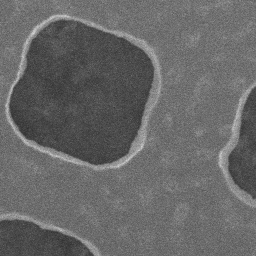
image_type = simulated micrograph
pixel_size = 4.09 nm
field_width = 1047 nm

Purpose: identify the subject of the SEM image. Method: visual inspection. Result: holes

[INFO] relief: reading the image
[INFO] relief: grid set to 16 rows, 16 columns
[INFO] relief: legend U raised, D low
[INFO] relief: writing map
UUUUUUUUUUUUUUUU
UUUDDUUUUUUUUUUU
UUDDDDDDUUUUUUUU
UUDDDDDDDUUUUUUU
UDDDDDDDDDUUUUUU
UDDDDDDDDDUUUUUU
UDDDDDDDDDUUUUUD
UDDDDDDDDUUUUUUD
UUDDDDDDDUUUUUUD
UUUDDDDDUUUUUUDD
UUUUUUUUUUUUUUDD
UUUUUUUUUUUUUUDD
UUUUUUUUUUUUUUUD
UUUUUUUUUUUUUUUU
DDDDUUUUUUUUUUUU
DDDDDUUUUUUUUUUU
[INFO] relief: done